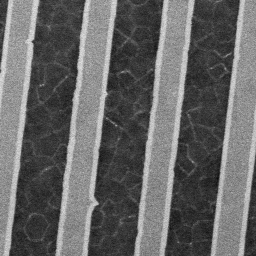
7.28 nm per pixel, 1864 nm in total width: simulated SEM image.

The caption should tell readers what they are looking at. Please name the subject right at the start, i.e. one or a few lines or trenches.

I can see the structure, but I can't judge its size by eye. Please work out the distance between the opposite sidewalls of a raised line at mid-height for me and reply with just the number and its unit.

0.188 um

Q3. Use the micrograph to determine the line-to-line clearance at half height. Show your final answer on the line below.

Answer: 376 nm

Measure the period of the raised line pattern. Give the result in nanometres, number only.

563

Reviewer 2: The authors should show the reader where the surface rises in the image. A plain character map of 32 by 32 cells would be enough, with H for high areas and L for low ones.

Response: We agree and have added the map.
LHHHLLLLLLLHHHLLLLLLLHHHLLLLLLHH
LHHHLLLLLLLHHHLLLLLLLHHHLLLLLLHH
LHHHLLLLLLLHHHLLLLLLHHHHLLLLLLHH
LHHHLLLLLLLHHHLLLLLLHHHHLLLLLLHH
LHHHLLLLLLHHHHLLLLLLHHHLLLLLLLHH
LHHHLLLLLLHHHHLLLLLLHHHLLLLLLLHH
LHHHLLLLLLHHHLLLLLLLHHHLLLLLLLHH
HHHHLLLLLLHHHLLLLLLLHHHLLLLLLLHH
HHHHLLLLLLHHHLLLLLLLHHHLLLLLLHHH
HHHLLLLLLLHHHLLLLLLLHHHLLLLLLHHH
HHHLLLLLLLHHHLLLLLLLHHHLLLLLLHHH
HHHLLLLLLLHHHLLLLLLHHHHLLLLLLHHH
HHHLLLLLLLHHHLLLLLLHHHHLLLLLLHHH
HHHLLLLLLHHHHLLLLLLHHHLLLLLLLHHH
HHHLLLLLLHHHHLLLLLLHHHLLLLLLLHHH
HHHLLLLLLHHHLLLLLLLHHHLLLLLLLHHH
HHHLLLLLLHHHLLLLLLLHHHLLLLLLHHHH
HHLLLLLLLHHHLLLLLLLHHHLLLLLLHHHH
HHLLLLLLLHHHLLLLLLLHHHLLLLLLHHHH
HHLLLLLLLHHHLLLLLLHHHHLLLLLLHHHH
HHLLLLLLLHHHLLLLLLHHHLLLLLLLHHHL
HHLLLLLLHHHHLLLLLLHHHLLLLLLLHHHL
HHLLLLLLHHHHLLLLLLHHHLLLLLLLHHHL
HHLLLLLLHHHHLLLLLLHHHLLLLLLLHHHL
HHLLLLLLHHHLLLLLLLHHHLLLLLLHHHHL
HHLLLLLLHHHHLLLLLLHHHLLLLLLHHHHL
HLLLLLLLHHHLLLLLLLHHHLLLLLLHHHHL
HLLLLLLLHHHLLLLLLLHHHLLLLLLHHHHL
HLLLLLLLHHHLLLLLLLHHHLLLLLLHHHLL
HLLLLLLHHHHLLLLLLHHHHLLLLLLHHHLL
HLLLLLLHHHHLLLLLLHHHLLLLLLLHHHLL
HLLLLLLHHHHLLLLLLHHHLLLLLLLHHHLL